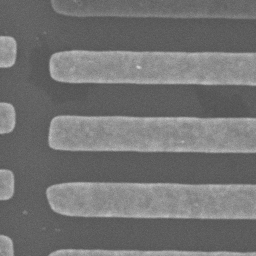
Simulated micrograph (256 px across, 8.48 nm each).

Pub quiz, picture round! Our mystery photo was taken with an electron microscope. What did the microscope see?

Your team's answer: wiring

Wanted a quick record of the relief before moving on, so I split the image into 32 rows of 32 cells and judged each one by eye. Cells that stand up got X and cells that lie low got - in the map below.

------XXXXXXXXXXXXXXXXXXXXXXXXXX
-------XXXXXXXXXXXXXXXXXXXXXXXXX
--------------------------------
--------------------------------
--------------------------------
XX------------------------------
XX------XXXXXXXXX---------------
XX----XXXXXXXXXXXXXXXXXXXXXXXXXX
------XXXXXXXXXXXXXXXXXXXXXXXXXX
------XXXXXXXXXXXXXXXXXXXXXXXXXX
-------------------------XXXXXXX
--------------------------------
--------------------------------
XX------------------------------
XX------------------------------
XX----XXXXXXXXXXXXXXXXXXXXXXXXXX
X-----XXXXXXXXXXXXXXXXXXXXXXXXXX
------XXXXXXXXXXXXXXXXXXXXXXXXXX
-------XXXXXXXXXXXXXXXXXXXXXXXXX
--------------------------------
--------------------------------
X-------------------------------
XX------------------------------
XX----XXXXXXXXXXXXXXXXXXXXXXXXXX
X-----XXXXXXXXXXXXXXXXXXXXXXXXXX
------XXXXXXXXXXXXXXXXXXXXXXXXXX
-------XXXXXXXXXXXXXXXXXXXXXXXXX
--------------------------------
--------------------------------
X-------------------------------
XX------------------------------
XX-----XXXXXXXXXXXXXXXXXXX-XX---